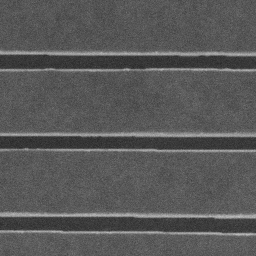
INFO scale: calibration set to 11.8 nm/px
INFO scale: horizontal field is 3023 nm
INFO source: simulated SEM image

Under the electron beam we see lines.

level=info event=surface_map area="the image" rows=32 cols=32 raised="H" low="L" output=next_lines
HHHHHHHHHHHHHHHHHHHHHHHHHHHHHHHH
HHHHHHHHHHHHHHHHHHHHHHHHHHHHHHHH
HHHHHHHHHHHHHHHHHHHHHHHHHHHHHHHH
HHHHHHHHHHHHHHHHHHHHHHHHHHHHHHHH
HHHHHHHHHHHHHHHHHHHHHHHHHHHHHHHH
HHHHHHHHHHHHHHHHHHHHHHHHHHHHHHHH
HHHHHHHHHHHHHHHHHHHHHHHHHHHHHHHH
LLLLLLLLLLLLLLLLLLLLLLLLLLLLLLLL
LLLLLLLLLLLLLLLLLLLLLLLLLLLLLLLL
HHHHHHHHHHHHHHHHHHHHHHHHHHHHHHHH
HHHHHHHHHHHHHHHHHHHHHHHHHHHHHHHH
HHHHHHHHHHHHHHHHHHHHHHHHHHHHHHHH
HHHHHHHHHHHHHHHHHHHHHHHHHHHHHHHH
HHHHHHHHHHHHHHHHHHHHHHHHHHHHHHHH
HHHHHHHHHHHHHHHHHHHHHHHHHHHHHHHH
HHHHHHHHHHHHHHHHHHHHHHHHHHHHHHHH
HHHHHHHHHHHHHHHHHHHHHHHHHHHHHHHH
LLLLLLLLLLLLLLLLLLLLLLLLLLLLLLLL
LLLLLLLLLLLLLLLLLLLLLLLLLLLLLLLL
HHHHHHHHHHHHHHHHHHHHHHHHHHHHHHHH
HHHHHHHHHHHHHHHHHHHHHHHHHHHHHHHH
HHHHHHHHHHHHHHHHHHHHHHHHHHHHHHHH
HHHHHHHHHHHHHHHHHHHHHHHHHHHHHHHH
HHHHHHHHHHHHHHHHHHHHHHHHHHHHHHHH
HHHHHHHHHHHHHHHHHHHHHHHHHHHHHHHH
HHHHHHHHHHHHHHHHHHHHHHHHHHHHHHHH
HHHHHHHHHHHHHHHHHHHHHHHHHHHHHHHH
LLLLLLLLLLLLLLLLLLLLLLLLLLLLLLLL
LLLLLLLLLLLLLLLLLLLLLLLLLLLLLLLL
HHHHHHHHHHHHHHHHHHHHHHHHHHHHHHHH
HHHHHHHHHHHHHHHHHHHHHHHHHHHHHHHH
HHHHHHHHHHHHHHHHHHHHHHHHHHHHHHHH